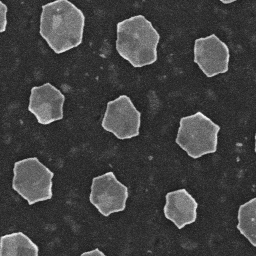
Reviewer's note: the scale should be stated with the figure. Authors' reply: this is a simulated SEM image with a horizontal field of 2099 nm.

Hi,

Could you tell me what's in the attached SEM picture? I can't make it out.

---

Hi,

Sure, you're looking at a regular array of raised bodies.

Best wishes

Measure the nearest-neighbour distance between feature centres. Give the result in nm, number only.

619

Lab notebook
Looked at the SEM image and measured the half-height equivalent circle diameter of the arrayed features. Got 313 nanometres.